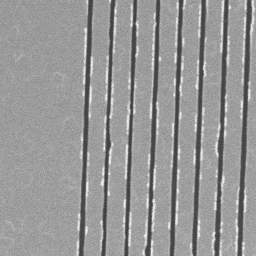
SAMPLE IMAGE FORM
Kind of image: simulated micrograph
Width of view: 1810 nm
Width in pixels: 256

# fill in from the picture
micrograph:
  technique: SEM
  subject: parallel lines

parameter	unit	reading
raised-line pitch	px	22.6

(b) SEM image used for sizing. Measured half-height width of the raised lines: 0.125 microns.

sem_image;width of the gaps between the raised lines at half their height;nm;34.4